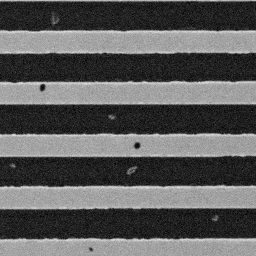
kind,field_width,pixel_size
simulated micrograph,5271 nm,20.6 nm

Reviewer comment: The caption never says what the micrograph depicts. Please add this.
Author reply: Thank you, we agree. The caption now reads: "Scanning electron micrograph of lines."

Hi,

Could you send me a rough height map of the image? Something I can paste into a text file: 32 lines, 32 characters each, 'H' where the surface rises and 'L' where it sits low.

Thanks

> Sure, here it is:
LLLLLLLLLLLLLLLLLLLLLLLLLLLLLLLL
LLLLLLLLLLLLLLLLLLLLLLLLLLLLLLLL
LLLLLLLLLLLLLLLLLLLLLLLLLLLLLLLL
LLLLLLLLLLLLLLLLLLLLLLLLLLLLLLLL
HHHHHHHHHHHHHHHHHHHHHHHHHHHHHHHH
HHHHHHHHHHHHHHHHHHHHHHHHHHHHHHHH
HHHHHHHHHHHHHHHHHHHHHHHHHHHHHHHH
LLLLLLLLLLLLLLLLLLLLLLLLLLLLLLLL
LLLLLLLLLLLLLLLLLLLLLLLLLLLLLLLL
LLLLLLLLLLLLLLLLLLLLLLLLLLLLLLLL
HHHHHHHHHHHHHHHHHHHHHHHHHHHHHHHH
HHHHHHHHHHHHHHHHHHHHHHHHHHHHHHHH
HHHHHHHHHHHHHHHHHHHHHHHHHHHHHHHH
LLLLLLLLLLLLLLLLLLLLLLLLLLLLLLLL
LLLLLLLLLLLLLLLLLLLLLLLLLLLLLLLL
LLLLLLLLLLLLLLLLLLLLLLLLLLLLLLLL
LLLLLLLLLLLLLLLLLLLLLLLLLLLLLLLL
HHHHHHHHHHHHHHHHHHHHHHHHHHHHHHHH
HHHHHHHHHHHHHHHHHHHHHHHHHHHHHHHH
HHHHHHHHHHHHHHHHHHHHHHHHHHHHLHHL
LLLLLLLLLLLLLLLLLLLLLLLLLLLLLLLL
LLLLLLLLLLLLLLLLLLLLLLLLLLLLLLLL
LLLLLLLLLLLLLLLLLLLLLLLLLLLLLLLL
HHHHHHHHHHHHHHHHHHHHHHHHHHHHHHHH
HHHHHHHHHHHHHHHHHHHHHHHHHHHHHHHH
HHHHHHHHHHHHHHHHHHHHHHHHHHHHHHHH
LLLLLLLLLLLLLLLLLLLLLLLLLLLLLLLL
LLLLLLLLLLLLLLLLLLLLLLLLLLLLLLLL
LLLLLLLLLLLLLLLLLLLLLLLLLLLLLLLL
LLLLLLLLLLLLLLLLLLLLLLLLLLLLLLLL
HHHHHHHHHHHHHHHHHHHHHHHHHHHHHHHH
HHHHHHHHHHHHHHHHHHHHHHHHHHHHHHHH